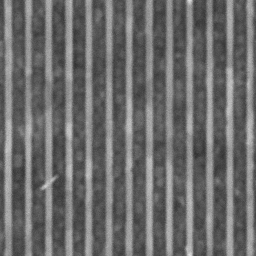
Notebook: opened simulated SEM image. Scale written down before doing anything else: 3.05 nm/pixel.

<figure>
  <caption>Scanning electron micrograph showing parallel lines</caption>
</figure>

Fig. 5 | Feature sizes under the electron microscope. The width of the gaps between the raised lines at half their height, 45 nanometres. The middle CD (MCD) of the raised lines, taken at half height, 0.0149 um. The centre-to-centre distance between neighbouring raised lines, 0.0614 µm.